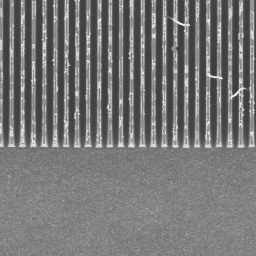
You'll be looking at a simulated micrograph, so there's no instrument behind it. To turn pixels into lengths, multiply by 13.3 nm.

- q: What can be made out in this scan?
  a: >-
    parallel lines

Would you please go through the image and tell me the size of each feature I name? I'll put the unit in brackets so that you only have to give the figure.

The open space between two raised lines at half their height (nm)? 79.9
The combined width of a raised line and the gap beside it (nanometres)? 146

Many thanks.